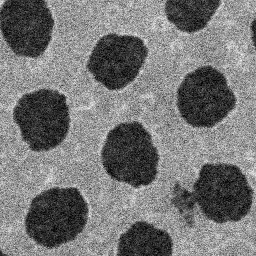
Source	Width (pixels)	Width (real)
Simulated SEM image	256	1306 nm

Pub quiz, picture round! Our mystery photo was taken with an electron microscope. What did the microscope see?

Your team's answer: raised bodies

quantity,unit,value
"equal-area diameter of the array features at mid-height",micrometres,0.321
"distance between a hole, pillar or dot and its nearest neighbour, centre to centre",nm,481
